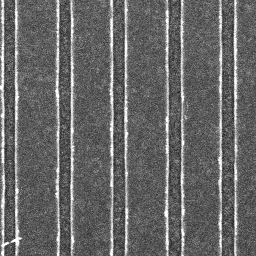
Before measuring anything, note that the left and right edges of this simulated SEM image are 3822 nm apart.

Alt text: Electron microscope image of parallel lines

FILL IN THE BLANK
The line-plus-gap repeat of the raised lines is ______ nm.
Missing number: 816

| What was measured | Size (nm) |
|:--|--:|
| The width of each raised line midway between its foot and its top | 629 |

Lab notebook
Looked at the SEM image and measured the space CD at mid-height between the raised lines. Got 190 nanometers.